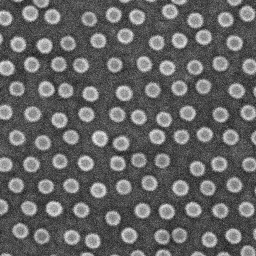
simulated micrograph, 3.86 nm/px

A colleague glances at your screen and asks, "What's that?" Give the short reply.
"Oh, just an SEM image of a regular array of raised bodies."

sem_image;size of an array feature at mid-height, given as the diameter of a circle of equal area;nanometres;51.1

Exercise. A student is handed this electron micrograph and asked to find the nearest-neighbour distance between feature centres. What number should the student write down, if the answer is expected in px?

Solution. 23.2